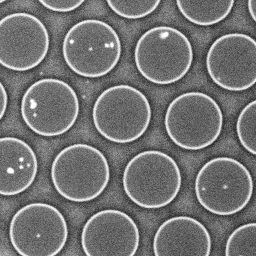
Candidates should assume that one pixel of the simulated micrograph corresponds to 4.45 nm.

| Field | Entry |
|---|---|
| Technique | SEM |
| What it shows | an array of small figures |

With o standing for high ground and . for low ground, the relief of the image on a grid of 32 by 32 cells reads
.....ooooo....oooooo..ooooooo..o
...............oooo....oooooo..o
ooooo...................oooo....
oooooo...ooooo......o...........
oooooo..ooooooo...ooooo.....ooo.
oooooo..ooooooo..ooooooo...ooooo
oooooo..ooooooo..ooooooo..oooooo
ooooo...ooooooo..ooooooo..oooooo
.ooo.....ooooo...ooooooo..oooooo
...........o......ooooo...oooooo
....oooo...................ooooo
o..oooooo....oooo...............
o..ooooooo..oooooo....ooooo.....
o..ooooooo..ooooooo..oooooo....o
...ooooooo..ooooooo..ooooooo..oo
....ooooo...oooooo...ooooooo..oo
.....ooo.....ooooo...oooooo...oo
oo............ooo.....ooooo...oo
oooo....oooo...........oo......o
oooo...oooooo....oooo...........
ooooo..oooooo...oooooo....oooo..
oooo...ooooooo..oooooo...oooooo.
oooo...oooooo...oooooo...oooooo.
ooo....oooooo...oooooo...oooooo.
........oooo....oooooo...oooooo.
....o............oooo....oooooo.
..ooooo......oo............oo...
..oooooo...ooooo.....ooo........
.ooooooo...oooooo...oooooo....oo
.ooooooo..ooooooo..ooooooo...ooo
..oooooo..ooooooo..ooooooo..oooo
..ooooo....oooooo..ooooooo..oooo